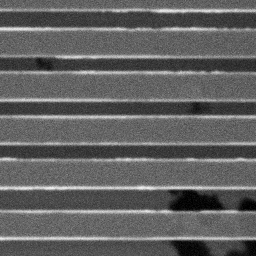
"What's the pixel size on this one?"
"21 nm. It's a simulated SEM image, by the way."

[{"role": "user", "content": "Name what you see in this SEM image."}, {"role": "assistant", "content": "lines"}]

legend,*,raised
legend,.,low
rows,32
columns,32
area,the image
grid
********************************
................................
................................
................................
********************************
********************************
********************************
................................
................................
********************************
********************************
********************************
********************************
................................
................................
********************************
********************************
********************************
................................
................................
********************************
********************************
********************************
*****.**************************
................................
................................
*******************.**...*..**..
********************************
********************************
********************************
................................
................................